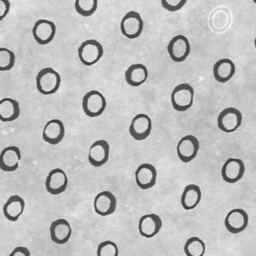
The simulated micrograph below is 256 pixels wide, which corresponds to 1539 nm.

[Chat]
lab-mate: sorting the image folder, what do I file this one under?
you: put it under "a regular array of ring-shaped grooves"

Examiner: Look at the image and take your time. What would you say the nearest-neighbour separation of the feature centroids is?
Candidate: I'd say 290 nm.